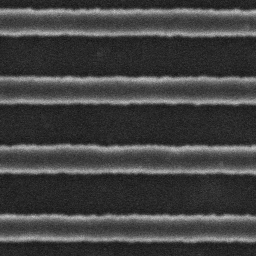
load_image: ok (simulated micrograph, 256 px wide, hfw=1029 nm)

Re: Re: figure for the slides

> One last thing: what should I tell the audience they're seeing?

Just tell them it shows lines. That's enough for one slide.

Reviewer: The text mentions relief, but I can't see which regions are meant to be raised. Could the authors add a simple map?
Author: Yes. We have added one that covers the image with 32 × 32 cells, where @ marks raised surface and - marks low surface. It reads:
--------------------------------
@@@@@@@@@@@@@@@@@@@@@@@@@@@@@@@@
@@@@@@@@@@@@@@@@@@@@@@@@@@@@@@@@
@@@@@@@@@@@@@@@@@@@@@@@@@@@@@@@@
--------------------------------
--------------------------------
--------------------------------
--------------------------------
--------------------------------
--------------------------------
@@@@@@@@@@@@@@@@@@@@@@@@@@@@@@@@
@@@@@@@@@@@@@@@@@@@@@@@@@@@@@@@@
@@@@@@@@@@@@@@@@@@@@@@@@@@@@@@@@
--------------------------------
--------------------------------
--------------------------------
--------------------------------
--------------------------------
@@@@@@@@@@@@@@@@@@@@@@@@@@@@@@@@
@@@@@@@@@@@@@@@@@@@@@@@@@@@@@@@@
@@@@@@@@@@@@@@@@@@@@@@@@@@@@@@@@
@@@@@@@@@@@@@@@@@@@@@@@@@@@@@@@@
--------------------------------
--------------------------------
--------------------------------
--------------------------------
--------------------------------
@@@@@@@@@@@@@@@@@@@@@@@@@@@@@@@@
@@@@@@@@@@@@@@@@@@@@@@@@@@@@@@@@
@@@@@@@@@@@@@@@@@@@@@@@@@@@@@@@@
--------------------------------
--------------------------------